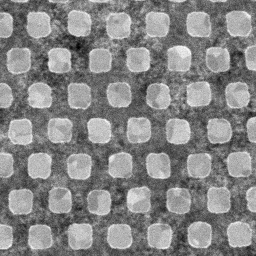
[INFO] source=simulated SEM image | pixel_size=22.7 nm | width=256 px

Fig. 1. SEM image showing a regular array of raised bodies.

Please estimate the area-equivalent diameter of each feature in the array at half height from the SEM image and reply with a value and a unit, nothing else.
570 nanometers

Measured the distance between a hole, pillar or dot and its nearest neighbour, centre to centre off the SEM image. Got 891 nanometers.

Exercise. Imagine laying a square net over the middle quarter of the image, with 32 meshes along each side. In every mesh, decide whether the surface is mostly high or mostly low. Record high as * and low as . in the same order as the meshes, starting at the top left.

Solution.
**.....*****....*****.....*****.
*......****......****......****.
................................
................................
................................
.*****.....*****.....*****.....*
.*****.....*****.....*****.....*
.*****.....******....*****.....*
.*****.....******....*****.....*
.*****.....*****.....*****.....*
..****......***.......****......
................................
................................
................................
**....*****.....*****.....*****.
**....*****.....*****.....*****.
**....*****.....*****.....*****.
**....*****.....******....*****.
**....*****.....*****.....*****.
.......****......*.........****.
................................
................................
..............**......*.*.......
.*****.....******....*****.....*
.******....******....*****.....*
.******....******....*****.....*
.******....******....*****.....*
.*****......*****....*****.....*
...***..........................
................................
................................
*................****.....*****.